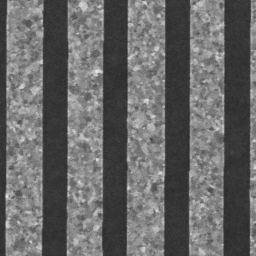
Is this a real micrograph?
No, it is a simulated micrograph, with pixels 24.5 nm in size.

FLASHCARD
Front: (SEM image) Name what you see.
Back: wiring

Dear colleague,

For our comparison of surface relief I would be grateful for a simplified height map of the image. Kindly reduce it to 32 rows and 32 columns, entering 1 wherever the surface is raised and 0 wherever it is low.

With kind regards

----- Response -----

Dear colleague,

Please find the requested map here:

01111000011110001111100011110001
01111000011110001111100011110001
01111000011110001111100011110001
01111000011110001111100011110001
01111000011110001111100011110001
01111000011110001111100011110001
01111000011110001111100011110001
01111000011110001111100011110001
01111000011110001111100011110001
01111000011110001111100011110001
01111000011110001111100011110001
01111000011110001111100011110001
01111000011110001111100011110001
01111000011110001111100011110001
01111000011110001111100011110001
01111000011110001111100011110001
01111000011110001111100011110001
01111000011110001111100011110001
01111000011110001111100011110001
01111000011110001111100011110001
01111000011110001111100011110001
01111000011110001111100011110001
01111000011110001111000011110001
01111000011110001111000011110001
01111000011110001111000011110001
01111000011110001111000011110001
01111000011110001111000011110001
01111000111110001111000011110001
01111000111110001111000011110001
01111000111110001111000011110001
01111000111110001111000011110001
01111000111110001111000011110001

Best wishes